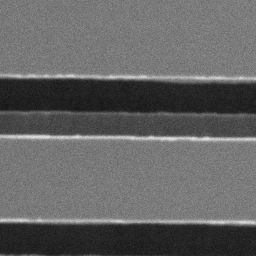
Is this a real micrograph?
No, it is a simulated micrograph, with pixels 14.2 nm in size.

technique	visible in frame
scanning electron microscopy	lines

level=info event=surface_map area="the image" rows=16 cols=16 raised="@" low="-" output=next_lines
@@@@@@@@@@@@@@@@
@@@@@@@@@@@@@@@@
@@@@@@@@@@@@@@@@
@@@@@@@@@@@@@@@@
@@@@@@@@@@@@@@@@
----------------
----------------
----------------
@@@@@-----------
@@@@@@@@@@@@@@@@
@@@@@@@@@@@@@@@@
@@@@@@@@@@@@@@@@
@@@@@@@@@@@@@@@@
@@@@@@@@@@@@@@@@
----------------
----------------